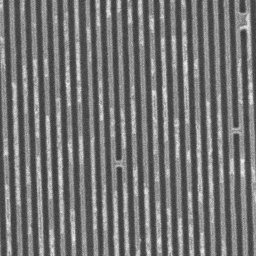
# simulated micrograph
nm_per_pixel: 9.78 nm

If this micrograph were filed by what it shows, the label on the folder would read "parallel lines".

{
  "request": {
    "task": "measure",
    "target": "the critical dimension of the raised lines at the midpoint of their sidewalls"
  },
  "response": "46.4 nm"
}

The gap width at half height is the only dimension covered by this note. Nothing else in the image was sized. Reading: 64.7 nanometers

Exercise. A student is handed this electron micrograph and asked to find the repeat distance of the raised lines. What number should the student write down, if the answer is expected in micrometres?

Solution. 0.105